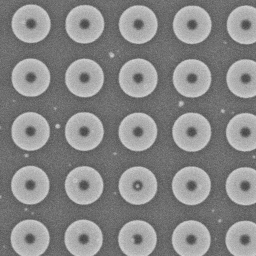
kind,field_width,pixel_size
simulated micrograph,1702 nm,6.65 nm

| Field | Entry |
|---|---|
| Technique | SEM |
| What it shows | an array of small figures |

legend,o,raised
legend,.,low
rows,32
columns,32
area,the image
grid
................................
..oooo...ooo....ooo...oooo...ooo
..oooo..ooooo..ooooo..oooo..oooo
..oooo..ooooo..ooooo..oooo..oooo
..oooo...ooo...oooo...oooo...ooo
................................
................................
...oo.....o.....oo.....oo.......
..oooo...oooo..oooo...oooo...ooo
..oooo..ooooo..ooooo..oooo..oooo
..oooo..ooooo..ooooo..oooo..oooo
..ooo....ooo....ooo...oooo...ooo
................................
................................
..ooo....ooo....ooo....oo.....oo
..oooo..ooooo..oooo...oooo...ooo
..oooo..ooooo..ooooo..oooo..oooo
..oooo..ooooo..oooo...oooo...ooo
...oo....ooo....oo.....oo....ooo
................................
................................
..ooo....ooo....ooo...oooo...ooo
.ooooo..ooooo..oooo...oooo..oooo
.ooooo..ooooo..ooooo..oooo..oooo
..oooo...ooo...oooo...oooo...ooo
.................o.....oo.....o.
................................
...o............................
..oooo...ooo...oooo...oooo...ooo
.ooooo..ooooo..ooooo..oooo..oooo
.ooooo..ooooo..oooo...oooo..oooo
..ooo....ooo...oooo...oooo...ooo